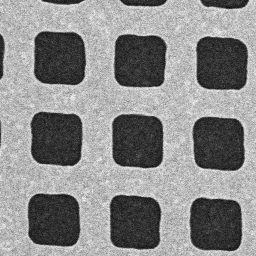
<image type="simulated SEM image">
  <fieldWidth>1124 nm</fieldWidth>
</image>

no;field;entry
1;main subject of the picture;a regular array of holes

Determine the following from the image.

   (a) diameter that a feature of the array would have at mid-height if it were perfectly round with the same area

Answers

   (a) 0.249 um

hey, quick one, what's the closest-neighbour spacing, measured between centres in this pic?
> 353 nm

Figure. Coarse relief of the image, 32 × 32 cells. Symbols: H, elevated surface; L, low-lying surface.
HHHHHHHLLHHHHHHHLLLLHHHHHLLLLLLH
HHHHHHHHHHHHHHHHHHHHHHHHHHHHHHHH
HHHHHHHHHHHHHHHHHHHHHHHHHHHHHHHH
HHHHHHHHHHHHHHHHHHHHHHHHHHHHHHHH
HHHHHLLLLLHHHHHLLLLLHHHHHHHHHHHH
LHHHLLLLLLLHHHLLLLLLLHHHHLLLLLHH
LHHHLLLLLLLHHHLLLLLLLHHHHLLLLLLH
HHHHLLLLLLLHHHLLLLLLLHHHHLLLLLLH
HHHHLLLLLLLHHHLLLLLLLHHHHLLLLLLH
HHHHLLLLLLLHHHLLLLLLLHHHHLLLLLLH
HHHHHHLLLLHHHHHLLLLLHHHHHLLLLLLH
HHHHHHHHHHHHHHHHHHHHHHHHHHHHHHHH
HHHHHHHHHHHHHHHHHHHHHHHHHHHHHHHH
HHHHHHHHHHHHHHHHHHHHHHHHHHHHHHHH
HHHHLLLLLLHHHHHLLLLHHHHHHHHHHHHH
HHHHLLLLLLHHHHLLLLLLHHHHLLLLLLHH
HHHHLLLLLLHHHHLLLLLLHHHHLLLLLLHH
HHHHLLLLLLHHHHLLLLLLHHHHLLLLLLLH
HHHHLLLLLLHHHHLLLLLLHHHHLLLLLLLH
HHHHLLLLLLHHHHLLLLLLHHHHLLLLLLLH
HHHHHLLLLHHHHHHLLLLLHHHHHLLLLLHH
HHHHHHHHHHHHHHHHHHHHHHHHHHHHHHHH
HHHHHHHHHHHHHHHHHHHHHHHHHHHHHHHH
HHHHHHHHHHHHHHHHHHHHHHHHHHHHHHHH
HHHHLLLLLHHHHHLLLLHHHHHHHHHHHHHH
HHHHLLLLLLHHHHLLLLLLHHHHLLLLLLHH
HHHLLLLLLLHHHHLLLLLLHHHHLLLLLLHH
HHHHLLLLLLHHHHLLLLLLHHHHLLLLLLHH
HHHLLLLLLLHHHHLLLLLLHHHHLLLLLLHH
HHHHLLLLLLHHHHLLLLLLHHHHLLLLLLHH
HHHHLLLLLHHHHHLLLLLLHHHHLLLLLLHH
HHHHHHHHHHHHHHHHHHHHHHHHHHHHHHHH